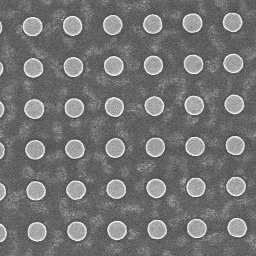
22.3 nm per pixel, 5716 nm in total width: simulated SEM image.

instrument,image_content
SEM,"a regular array of raised bodies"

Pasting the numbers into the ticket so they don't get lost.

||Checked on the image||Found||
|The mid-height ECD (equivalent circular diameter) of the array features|427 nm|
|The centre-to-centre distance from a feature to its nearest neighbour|891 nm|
